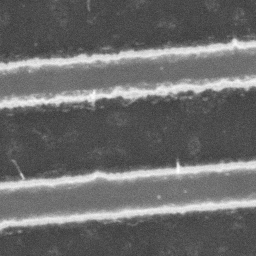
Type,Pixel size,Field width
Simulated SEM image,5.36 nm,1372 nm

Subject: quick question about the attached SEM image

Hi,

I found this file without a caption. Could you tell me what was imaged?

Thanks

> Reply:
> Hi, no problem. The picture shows one or a few lines or trenches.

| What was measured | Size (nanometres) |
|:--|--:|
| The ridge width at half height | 210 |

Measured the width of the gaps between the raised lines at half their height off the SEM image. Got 431 nanometers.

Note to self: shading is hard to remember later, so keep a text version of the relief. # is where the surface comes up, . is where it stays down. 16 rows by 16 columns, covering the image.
................
................
................
.......#########
################
#############...
##..............
................
................
................
.............###
.###############
################
#######.........
................
................